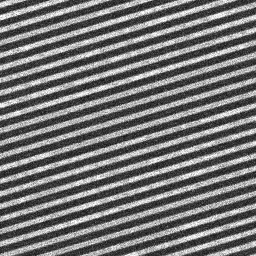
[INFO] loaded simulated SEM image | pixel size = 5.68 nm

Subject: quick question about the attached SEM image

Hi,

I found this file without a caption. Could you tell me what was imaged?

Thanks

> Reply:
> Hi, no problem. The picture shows parallel lines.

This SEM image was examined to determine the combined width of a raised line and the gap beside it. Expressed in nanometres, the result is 68.5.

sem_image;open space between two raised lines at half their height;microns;0.0395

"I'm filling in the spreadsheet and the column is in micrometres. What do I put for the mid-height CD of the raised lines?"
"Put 0.0292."